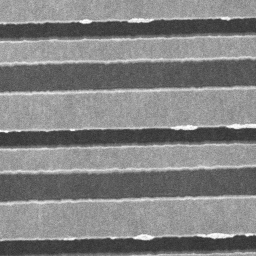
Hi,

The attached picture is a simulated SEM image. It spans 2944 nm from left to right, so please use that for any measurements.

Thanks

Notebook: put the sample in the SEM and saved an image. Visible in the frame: lines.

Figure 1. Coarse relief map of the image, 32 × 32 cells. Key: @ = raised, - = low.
@@@@@@@@@@@@@@@@@@@@@@@@@@@@@@@@
@@@@@@@@@@@@@@@@@@@@@@@@@@@@@@@@
@@@@@@@@@@@@@@@@@@@@------------
--------------------------------
-------------------------------@
@@@@@@@@@@@@@@@@@@@@@@@@@@@@@@@@
@@@@@@@@@@@@@@@@@@@@@@@@@@@@@@@@
@@@@@@@@@@@@@@@@@@-@--@---------
--------------------------------
--------------------------------
--------------------------------
-----------@@@@@@@@@@@@@@@@@@@@@
@@@@@@@@@@@@@@@@@@@@@@@@@@@@@@@@
@@@@@@@@@@@@@@@@@@@@@@@@@@@@@@@@
@@@@@@@@@@@@@@@@@@@@@@@@@@@@@@@@
@@@@@@@@@@@@@@@@@@@@@@@@@@@@@@@@
@-------------------------------
--------------------------------
---------@@@@@@@@@@@@@@@@@@@@@@@
@@@@@@@@@@@@@@@@@@@@@@@@@@@@@@@@
@@@@@@@@@@@@@@@@@@@@@@@@@@@@@@@@
@@--@---------------------------
--------------------------------
--------------------------------
--------------------------------
@@@@@@@@@@@@@@@@@@@@@@@@@@@@@@@@
@@@@@@@@@@@@@@@@@@@@@@@@@@@@@@@@
@@@@@@@@@@@@@@@@@@@@@@@@@@@@@@@@
@@@@@@@@@@@@@@@@@@@@@@@@@@@@@@@@
@@@@@@@@@@@@@@@@@@@@@-@--@@@@---
--------------------------------
--------------------------------